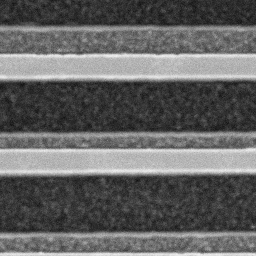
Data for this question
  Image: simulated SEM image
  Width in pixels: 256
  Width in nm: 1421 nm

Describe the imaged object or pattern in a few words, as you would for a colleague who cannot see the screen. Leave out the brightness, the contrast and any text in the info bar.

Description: lines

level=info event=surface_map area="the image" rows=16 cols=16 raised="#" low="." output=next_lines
................
................
################
################
################
................
................
................
..##############
################
################
................
................
................
................
################